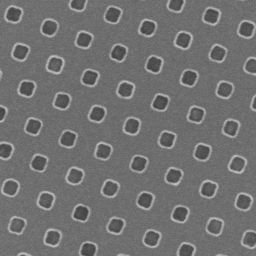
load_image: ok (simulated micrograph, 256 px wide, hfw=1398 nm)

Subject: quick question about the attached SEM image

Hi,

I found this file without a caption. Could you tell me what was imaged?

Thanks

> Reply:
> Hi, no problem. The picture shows a regular array of holes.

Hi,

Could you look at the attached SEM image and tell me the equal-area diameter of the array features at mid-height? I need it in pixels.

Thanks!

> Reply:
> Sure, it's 16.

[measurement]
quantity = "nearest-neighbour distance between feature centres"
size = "202 nm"